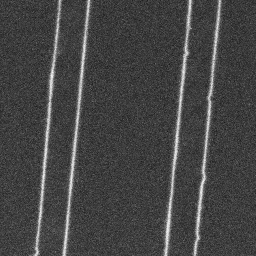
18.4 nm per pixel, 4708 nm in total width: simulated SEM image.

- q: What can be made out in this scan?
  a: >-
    one or a few lines or trenches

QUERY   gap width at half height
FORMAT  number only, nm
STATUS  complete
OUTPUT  1840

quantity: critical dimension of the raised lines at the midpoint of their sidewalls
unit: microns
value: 0.545